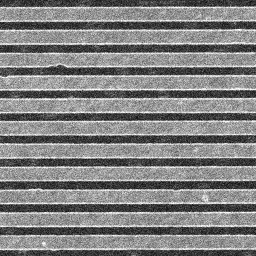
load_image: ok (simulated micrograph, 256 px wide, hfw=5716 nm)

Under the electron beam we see parallel lines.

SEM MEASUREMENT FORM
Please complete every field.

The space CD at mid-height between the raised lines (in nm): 206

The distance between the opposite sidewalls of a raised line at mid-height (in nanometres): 304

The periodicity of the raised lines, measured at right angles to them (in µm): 0.509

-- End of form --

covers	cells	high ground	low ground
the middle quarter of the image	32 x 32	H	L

HHHHHHHHHHHHHHHHHHHHHHHHHHHHHHHH
LLLLLLLLLLLLLLLLLLLLLLLLLLLLLLLL
LLLLLLLLLLLLLLLLLLLLLLLLLLLLLLLL
HHHHHHHHHHHHHHHHHHHHHHHHHHHHHHHH
HHHHHHHHHHHHHHHHHHHHHHHHHHHHHHHH
HHHHHHHHHHHHHHHHHHHHHHHHHHHHHHHH
LLLLLLLLLLLLLLLLLLLLLLLLLLLLLLLL
LLLLLLLLLLLLLLLLLLLLLLLLLLLLLLLL
LLLLLLLLLLLLLLLLLLLLLLLLLLLLLLLL
HHHHHHHHHHHHHHHHHHHHHHHHHHHHHHHH
HHHHHHHHHHHHHHHHHHHHHHHHHHHHHHHH
HHHHHHHHHHHHHHHHHHHHHHHHHHHHHHHH
LLLLLLLLLLLLLLLLLLLLLLLLLLLLLLLL
LLLLLLLLLLLLLLLLLLLLLLLLLLLLLLLL
HHHHHHHHHHHHHHHHHHHHHHHHHHHHHHHH
HHHHHHHHHHHHHHHHHHHHHHHHHHHHHHHH
HHHHHHHHHHHHHHHHHHHHHHHHHHHHHHHH
HHHHHHHHHHHHHHHHHHHHLHHHHHHHHHHH
LLLLLLLLLLLLLLLLLLLLLLLLLLLLLLLL
LLLLLLLLLLLLLLLLLLLLLLLLLLLLLLLL
HHHHHHHHHHHHHHHHHHHHHHHHHHHHHHHH
HHHHHHHHHHHHHHHHHHHHHHHHHHHHHHHH
HHHHHHHHHHHHHHHHHHHHHHHHHHHHHHHH
LLLLLLLLLLLLLLLLLLLLLLLLLLLLLLLL
LLLLLLLLLLLLLLLLLLLLLLLLLLLLLLLL
LLLLLLLLLLLLLLLLLLLLLLLLLLLLLLLL
HHHHHHHHHHHHHHHHHHHHHHHHHHHHHHHH
HHHHHHHHHHHHHHHHHHHHHHHHHHHHHHHH
HHHHHHHHHHHHHHHHHHHHHHHHHHHHHHHH
LLLLLLLLLLLLLLLLLLLLLLLLLLLLLLLL
LLLLLLLLLLLLLLLLLLLLLLLLLLLLLLLL
LLLLLLLLLLLLLLLLLLLLLLLLLLLLLHHH